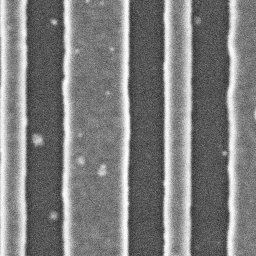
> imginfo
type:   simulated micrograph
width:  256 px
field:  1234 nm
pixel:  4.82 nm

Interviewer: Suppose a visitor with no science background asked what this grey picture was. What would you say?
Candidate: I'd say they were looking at lines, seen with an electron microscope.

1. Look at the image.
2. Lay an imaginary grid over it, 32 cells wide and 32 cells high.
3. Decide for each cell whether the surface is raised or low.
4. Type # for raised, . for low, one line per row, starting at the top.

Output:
###.....########.....###.....###
###.....########.....###.....###
###.....########.....###.....###
###.....########.....###.....###
###.....########.....###.....###
###.....########.....###.....###
###.....########.....###.....###
###.....########.....###.....###
###.....########.....###.....###
###.....########.....###.....###
###.....########.....###.....###
###.....########.....###.....###
###.....########.....###.....###
###.....########.....###.....###
###.....########.....###.....###
###.....########.....###.....###
###.....########.....###.....###
###.....########.....###.....###
###.....########.....###.....###
###.....########.....###.....###
###.....########.....###.....###
###.....########.....###.....###
###.....########.....###.....###
###.....########.....###.....###
###.....########.....###.....###
###.....########.....###.....###
###.....########.....###.....###
###.....########.....###.....###
###.....########.....###.....###
###.....########.....###.....###
###.....########.....###.....###
###.....########.....###.....###